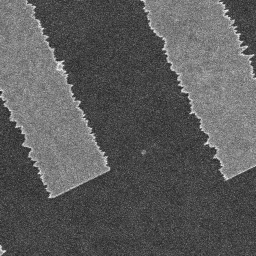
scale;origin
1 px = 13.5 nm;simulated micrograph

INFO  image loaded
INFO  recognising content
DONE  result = one or a few lines or trenches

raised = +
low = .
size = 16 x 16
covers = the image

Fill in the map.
++.......+++++..
++.......++++++.
+++.......+++++.
+++.......+++++.
++++.......+++++
++++.......+++++
+++++.......++++
.++++.......++++
.+++++.......+++
..++++.......+++
..+++++.......++
...++...........
................
................
................
................